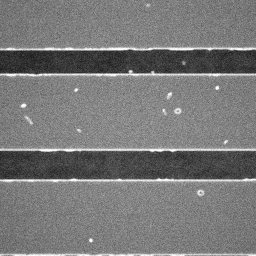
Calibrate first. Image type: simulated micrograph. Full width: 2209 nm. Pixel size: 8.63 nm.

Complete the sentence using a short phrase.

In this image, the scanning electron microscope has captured lines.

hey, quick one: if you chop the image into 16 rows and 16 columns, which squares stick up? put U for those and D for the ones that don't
UUUUUUUUUUUUUUUU
UUUUUUUUUUUUUUUU
UUUUUUUUUUUUUUUU
DDDDDDDDDDDDDDDD
DDDDDDDDDDDDDDDD
UUUUUUUUUUUUUUUU
UUUUUUUUUUUUUUUU
UUUUUUUUUUUUUUUU
UUUUUUUUUUUUUUUU
DDDDDDDDDDDDDDDD
DDDDDDDDDDDDDDDD
UUUUUUUUUUUUUUUU
UUUUUUUUUUUUUUUU
UUUUUUUUUUUUUUUU
UUUUUUUUUUUUUUUU
UUUUUUUUUUUUUUUU